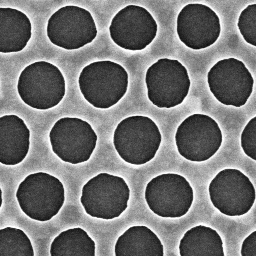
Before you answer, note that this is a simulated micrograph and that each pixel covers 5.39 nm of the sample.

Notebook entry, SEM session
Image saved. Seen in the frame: a regular array of holes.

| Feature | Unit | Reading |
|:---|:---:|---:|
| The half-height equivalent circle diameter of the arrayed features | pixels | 47.4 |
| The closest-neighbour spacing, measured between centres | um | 0.337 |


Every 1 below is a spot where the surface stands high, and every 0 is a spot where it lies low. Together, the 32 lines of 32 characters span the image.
11111111111111111111111100111111
00011110000111100001111000011100
00001100000011000001110000011100
00001100000011000000110000001100
00001100000011000001110000011100
00011110000111100001111000011110
00111111111111111111111111111111
11111111111111111111001111100011
11100001110000011110000111000001
11000000110000001100000011000000
11000000110000001100000011000000
11000000110000001100000011000000
11100000111000011110000111100001
11110011111100111111011111111111
00111111111111110011111100111111
00011110000111100000110000011110
00001100000011000000110000001100
00001100000011000000110000001100
00001100000011000000110000011100
00011110000111100001111000111110
00111111111111110011111111111111
11111111111111111111111111100011
11100001111000001110000111000001
11000000110000001100000011000000
11000000110000001100000011000000
11000000110000001100000011100000
11100001111000011110000111100001
11110011111111111111111111111111
10111111111111110001111100111111
00011110000111100000111000010110
00001100000011000000110000001100
00001100000011000000110000001100